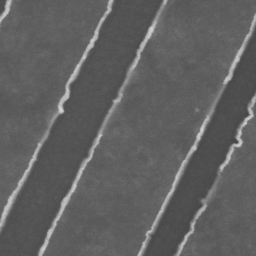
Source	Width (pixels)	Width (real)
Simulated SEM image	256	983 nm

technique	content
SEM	one or a few lines or trenches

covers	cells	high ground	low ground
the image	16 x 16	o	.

ooooooo...oooooo
oooooo....oooooo
oooooo...oooooo.
ooooo....oooooo.
ooooo...ooooooo.
oooo....oooooo..
oooo...oooooo...
ooo....oooooo..o
ooo...ooooooo..o
oo....oooooo..oo
oo...oooooo...oo
o....oooooo..ooo
o...ooooooo..ooo
....oooooo..oooo
...ooooooo..oooo
...oooooo..ooooo